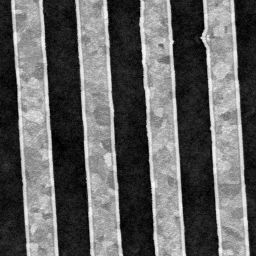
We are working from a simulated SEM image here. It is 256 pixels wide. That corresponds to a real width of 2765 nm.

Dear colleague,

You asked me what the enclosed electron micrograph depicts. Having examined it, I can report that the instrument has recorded one or a few lines or trenches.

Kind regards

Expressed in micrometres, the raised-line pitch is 0.687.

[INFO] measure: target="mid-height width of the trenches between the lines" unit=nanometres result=377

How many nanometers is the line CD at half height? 306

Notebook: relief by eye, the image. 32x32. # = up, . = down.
..###.....###.....###.....###...
..###.....###.....###.....###...
..###.....###.....###.....###...
..###.....###.....###.....###...
..###.....###.....###....####...
..###.....###.....###.....###...
..####....####....###.....###...
..####....####....####....###...
..####....####....####....####..
..####....####....####....####..
..####....####....####....####..
..####....####....####....####..
..####....####....####....####..
..####....####....####....####..
...###....####....####....####..
...###.....###....####.....###..
...###.....###.....###.....###..
...###.....###.....###.....###..
...###.....###.....###.....###..
...###.....###.....###.....###..
...###.....###.....###.....###..
...###.....###.....###.....###..
...####....###.....###.....###..
...####....####....####....###..
...####....####....####....###..
...####....####....####....####.
...####....####....####....####.
...####....####....####....####.
...####....####....####....####.
...####....####....####....####.
...####....####....####.....###.
....###....####.....###.....###.